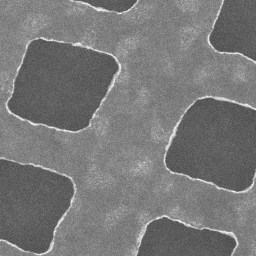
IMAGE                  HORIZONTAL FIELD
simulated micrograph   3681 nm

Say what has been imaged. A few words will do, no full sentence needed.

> holes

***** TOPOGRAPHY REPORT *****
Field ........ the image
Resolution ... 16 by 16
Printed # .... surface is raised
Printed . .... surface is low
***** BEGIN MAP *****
######..######..
#############...
##.##########...
##.....########.
#......#########
#......#########
#.....######...#
##....#####.....
###########.....
##########......
...########.....
.....########...
.....###########
....############
...######.....##
#..######......#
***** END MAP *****